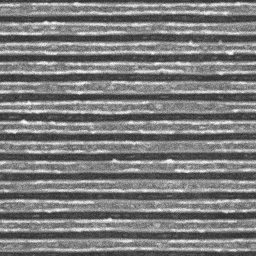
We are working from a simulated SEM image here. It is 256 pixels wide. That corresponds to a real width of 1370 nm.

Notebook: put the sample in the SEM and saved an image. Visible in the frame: parallel lines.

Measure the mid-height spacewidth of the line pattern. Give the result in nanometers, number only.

42.8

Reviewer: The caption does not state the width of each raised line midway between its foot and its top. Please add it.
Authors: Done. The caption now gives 62.2 nanometres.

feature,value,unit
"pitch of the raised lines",0.105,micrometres